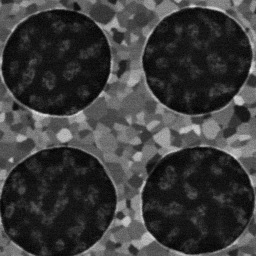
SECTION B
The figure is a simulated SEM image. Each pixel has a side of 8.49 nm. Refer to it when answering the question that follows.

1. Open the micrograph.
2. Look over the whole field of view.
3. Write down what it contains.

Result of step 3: holes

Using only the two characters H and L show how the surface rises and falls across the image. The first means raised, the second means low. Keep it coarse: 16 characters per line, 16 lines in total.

HHHHHHHHHHHHLHHH
HLLLLLHHHHLLLLLH
LLLLLLLHHLLLLLLL
LLLLLLLHHLLLLLLL
LLLLLLLHHLLLLLLL
HLLLLLHHHLLLLLLH
HLLLLLHHHHLLLLHH
HHHHHHHHHHHHHHHH
HHHHHHHHHHHHHHHH
HHLLLHHHHHHLLLHH
HLLLLLLHHHLLLLLH
LLLLLLLHHLLLLLLL
LLLLLLLHHLLLLLLL
LLLLLLLHHLLLLLLL
LLLLLLLHHLLLLLLH
HLLLLLHHHHHLLLHH